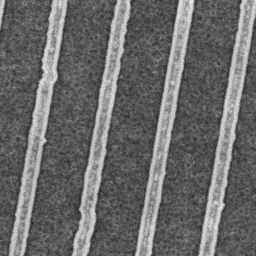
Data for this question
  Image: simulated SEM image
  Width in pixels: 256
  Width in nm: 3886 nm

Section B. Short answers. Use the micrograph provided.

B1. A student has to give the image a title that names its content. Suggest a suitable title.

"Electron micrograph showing one or a few lines or trenches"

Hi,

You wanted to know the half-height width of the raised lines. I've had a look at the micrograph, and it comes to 165 nm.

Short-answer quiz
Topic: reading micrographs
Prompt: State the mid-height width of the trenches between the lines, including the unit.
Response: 778 nm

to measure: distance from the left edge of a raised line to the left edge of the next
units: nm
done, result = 944